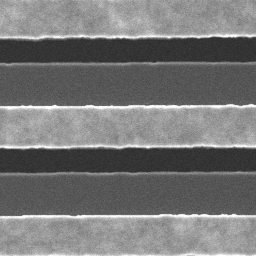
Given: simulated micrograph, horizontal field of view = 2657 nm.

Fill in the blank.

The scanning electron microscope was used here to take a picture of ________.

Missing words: lines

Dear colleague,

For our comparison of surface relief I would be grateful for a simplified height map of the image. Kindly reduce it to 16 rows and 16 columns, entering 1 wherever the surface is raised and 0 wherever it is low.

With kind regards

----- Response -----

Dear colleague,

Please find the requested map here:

1111111111111111
1111111111111111
0000000000000000
0000000000000000
1111111111111111
1111111111111111
1111111111111111
1111111111111111
1111111111111111
0000000000000000
0000000000000000
1111111111111111
1111111111111111
1111111111111111
1111111111111111
1111111111111111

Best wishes